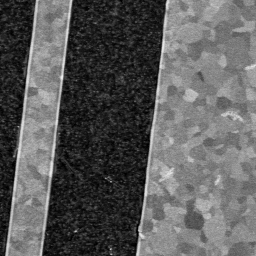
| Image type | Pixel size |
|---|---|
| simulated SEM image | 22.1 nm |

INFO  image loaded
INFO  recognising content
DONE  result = one or a few lines or trenches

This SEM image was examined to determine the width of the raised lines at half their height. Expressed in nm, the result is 754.